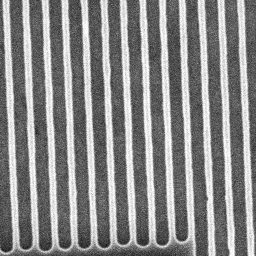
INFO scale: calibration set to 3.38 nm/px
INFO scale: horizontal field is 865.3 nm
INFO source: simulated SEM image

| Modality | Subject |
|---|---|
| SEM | parallel lines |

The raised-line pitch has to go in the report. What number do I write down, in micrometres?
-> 0.0661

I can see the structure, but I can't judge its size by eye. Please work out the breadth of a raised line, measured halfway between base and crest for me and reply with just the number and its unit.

19.9 nm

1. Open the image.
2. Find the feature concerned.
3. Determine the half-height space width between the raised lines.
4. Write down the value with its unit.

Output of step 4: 48.6 nanometers